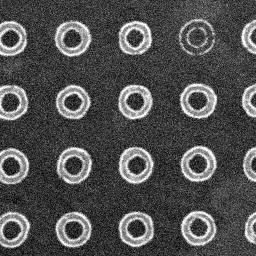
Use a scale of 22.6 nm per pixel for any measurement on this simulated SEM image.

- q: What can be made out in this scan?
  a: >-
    a regular array of ring-shaped raised bodies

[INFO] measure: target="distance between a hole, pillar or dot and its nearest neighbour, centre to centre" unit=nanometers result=1400